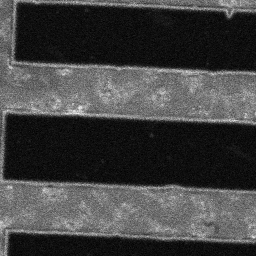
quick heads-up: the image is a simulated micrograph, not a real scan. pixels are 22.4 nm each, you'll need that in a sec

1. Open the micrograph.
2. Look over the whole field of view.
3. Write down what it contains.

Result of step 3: one or a few lines or trenches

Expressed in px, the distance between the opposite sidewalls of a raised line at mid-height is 69.9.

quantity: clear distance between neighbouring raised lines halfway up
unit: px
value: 47.2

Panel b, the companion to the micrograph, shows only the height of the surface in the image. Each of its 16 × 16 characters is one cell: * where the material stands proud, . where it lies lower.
.***********....
.***************
.***************
.***************
............****
................
................
*************...
****************
****************
****************
..**************
................
................
.**.............
****************